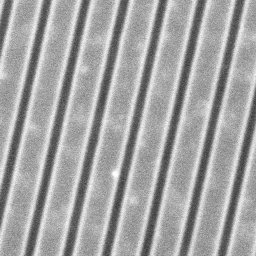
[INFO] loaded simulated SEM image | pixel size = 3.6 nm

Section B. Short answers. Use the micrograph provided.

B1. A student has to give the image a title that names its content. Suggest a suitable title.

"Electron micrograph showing parallel lines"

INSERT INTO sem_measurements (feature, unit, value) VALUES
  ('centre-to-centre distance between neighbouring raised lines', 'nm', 136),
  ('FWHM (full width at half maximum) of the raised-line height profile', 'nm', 98.3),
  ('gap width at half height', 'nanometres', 39.9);